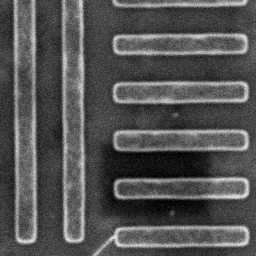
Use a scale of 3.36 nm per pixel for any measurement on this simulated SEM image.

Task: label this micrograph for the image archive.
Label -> groups of lines, slits or small figures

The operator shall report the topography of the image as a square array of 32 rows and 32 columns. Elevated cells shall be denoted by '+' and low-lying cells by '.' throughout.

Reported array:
..++....++.....+++++++++++++++..
..++....++......................
..++....++......................
..++....++......................
..++....++.........+++++++++++..
..++....++....+++++++++++++++++.
..++....++.....++++++++++++++...
..++....++......................
..++....++......................
..++....++......................
..++....++.....++++++++++++++++.
..++....++....+++++++++++++++++.
..++....++.....+++++++++++++++..
..++....++......................
..++....++......................
..++....++......................
..++....++......++..++++++++++..
..++....++....+++++++++++++++++.
..++....++.....++++++++++++++++.
..++....++......................
..++....++......................
..++....++......................
..++....++.....++++++++++++++++.
..++....++....+++++++++++++++++.
..++....++.....++++++++++++++++.
..++....++......................
..++....++......................
..++....++......................
..++....++..........++++++++++..
..++....++.....++++++++++++++++.
...............+++++++++++++++..
................................